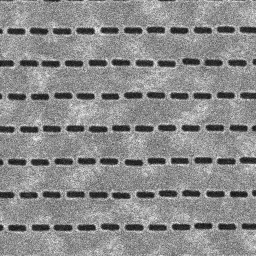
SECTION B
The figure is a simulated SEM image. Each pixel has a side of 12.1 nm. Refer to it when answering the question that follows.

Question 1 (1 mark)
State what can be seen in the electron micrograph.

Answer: a regular array of holes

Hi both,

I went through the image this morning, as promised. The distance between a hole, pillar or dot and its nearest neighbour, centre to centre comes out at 276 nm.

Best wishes